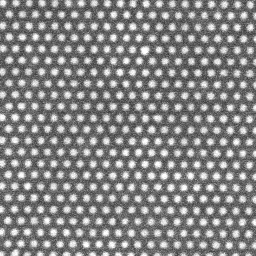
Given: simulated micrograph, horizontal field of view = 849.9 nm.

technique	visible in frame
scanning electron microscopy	a regular array of raised bodies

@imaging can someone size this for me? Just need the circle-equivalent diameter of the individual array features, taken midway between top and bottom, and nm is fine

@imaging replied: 20.5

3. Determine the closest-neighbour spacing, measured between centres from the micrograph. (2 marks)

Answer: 42.7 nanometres